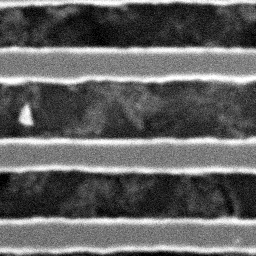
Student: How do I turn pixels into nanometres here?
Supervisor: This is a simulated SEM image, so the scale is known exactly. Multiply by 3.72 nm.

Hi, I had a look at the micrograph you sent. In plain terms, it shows lines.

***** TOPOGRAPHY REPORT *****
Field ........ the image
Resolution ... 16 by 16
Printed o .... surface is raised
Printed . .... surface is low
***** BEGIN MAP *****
................
................
................
oooooooooooooooo
oooooooooooooooo
................
................
................
................
oooooooooooooooo
oooooooooooooooo
................
................
................
oooooooooooooooo
oooooooooooooooo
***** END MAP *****